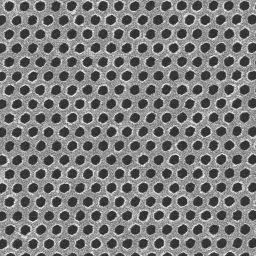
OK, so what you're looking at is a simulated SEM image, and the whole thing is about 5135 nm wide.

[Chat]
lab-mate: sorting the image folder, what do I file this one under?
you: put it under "a regular array of holes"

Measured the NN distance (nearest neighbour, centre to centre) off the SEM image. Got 308 nm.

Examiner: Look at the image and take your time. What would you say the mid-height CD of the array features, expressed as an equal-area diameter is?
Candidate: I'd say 200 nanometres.